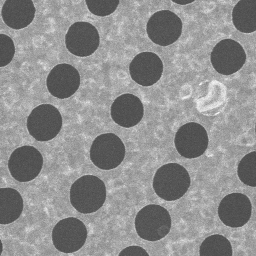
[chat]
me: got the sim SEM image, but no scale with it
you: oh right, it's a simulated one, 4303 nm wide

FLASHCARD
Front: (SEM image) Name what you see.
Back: a regular array of holes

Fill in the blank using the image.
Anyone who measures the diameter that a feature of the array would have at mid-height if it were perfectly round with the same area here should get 603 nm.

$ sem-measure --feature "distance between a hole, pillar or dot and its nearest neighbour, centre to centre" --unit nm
759